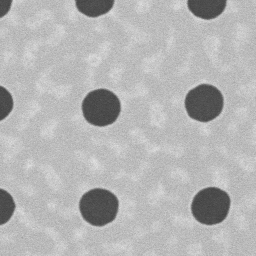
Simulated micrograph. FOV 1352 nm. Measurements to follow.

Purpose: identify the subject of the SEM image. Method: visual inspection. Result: holes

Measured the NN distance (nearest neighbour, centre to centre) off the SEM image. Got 535 nm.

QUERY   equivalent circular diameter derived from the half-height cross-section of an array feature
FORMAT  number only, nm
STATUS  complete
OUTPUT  202